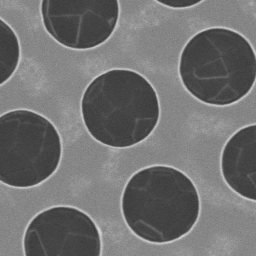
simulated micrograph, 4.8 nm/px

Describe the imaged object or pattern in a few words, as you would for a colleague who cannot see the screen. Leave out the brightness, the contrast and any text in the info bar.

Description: holes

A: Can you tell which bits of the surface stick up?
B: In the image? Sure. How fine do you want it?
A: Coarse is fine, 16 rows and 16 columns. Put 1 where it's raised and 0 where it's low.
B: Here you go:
1110000111111111
1110000111111111
0111000111110001
0111111111100000
0111111011100000
1111100001110000
1111100000111011
0001100000111111
0000110001111110
0000111111111100
0001111110011100
0011111100001100
1111111100001111
1100011100001111
1100001100001111
1100001111111111